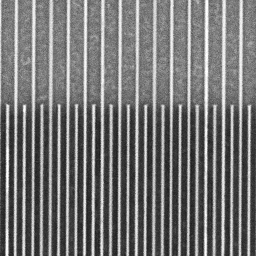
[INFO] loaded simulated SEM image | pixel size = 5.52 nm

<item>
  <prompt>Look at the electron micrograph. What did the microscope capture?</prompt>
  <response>parallel lines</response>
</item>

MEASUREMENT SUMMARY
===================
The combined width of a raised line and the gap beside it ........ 47.7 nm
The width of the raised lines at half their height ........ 11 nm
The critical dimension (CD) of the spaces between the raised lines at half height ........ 32.4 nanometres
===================